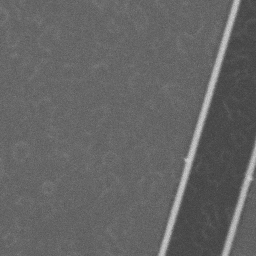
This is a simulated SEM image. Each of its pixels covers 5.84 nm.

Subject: one or a few lines or trenches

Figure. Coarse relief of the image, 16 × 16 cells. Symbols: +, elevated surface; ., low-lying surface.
...............+
..............++
..............++
..............++
.............+++
.............+++
.............+++
.............+++
............++++
............++++
............++++
...........++++.
...........++++.
...........++++.
...........+++..
..........++++..